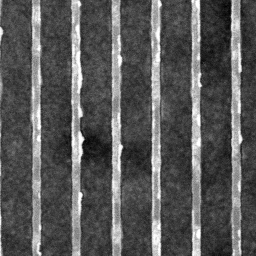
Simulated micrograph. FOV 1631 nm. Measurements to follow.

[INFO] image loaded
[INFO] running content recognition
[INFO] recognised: parallel lines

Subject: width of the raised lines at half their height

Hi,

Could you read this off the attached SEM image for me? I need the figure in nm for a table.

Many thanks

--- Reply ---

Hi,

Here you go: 48.5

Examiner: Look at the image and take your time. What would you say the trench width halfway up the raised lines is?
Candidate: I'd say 201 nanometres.